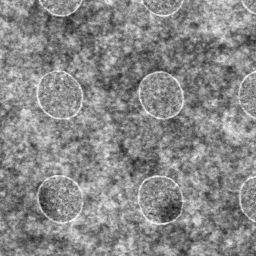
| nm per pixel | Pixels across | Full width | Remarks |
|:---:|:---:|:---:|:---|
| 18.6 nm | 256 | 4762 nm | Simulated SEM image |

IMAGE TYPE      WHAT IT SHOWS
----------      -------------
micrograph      raised bodies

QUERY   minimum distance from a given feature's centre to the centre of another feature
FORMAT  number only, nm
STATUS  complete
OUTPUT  1870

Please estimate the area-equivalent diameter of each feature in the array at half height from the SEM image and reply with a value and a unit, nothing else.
0.864 microns